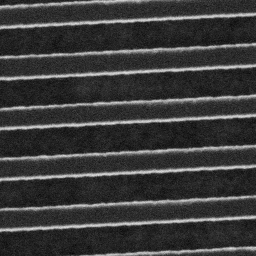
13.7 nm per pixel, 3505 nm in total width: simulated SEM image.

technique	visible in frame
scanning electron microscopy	lines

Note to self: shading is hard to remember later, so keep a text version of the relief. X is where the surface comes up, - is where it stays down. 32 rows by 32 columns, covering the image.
------XXXXXXXXXXXXXXXXXXXXXXXXXX
XXXXXXXXXXXXXXXXXXXXXXXXXXXXXXXX
XXXXXXXXXXXXXXXXXXXX------------
--------------------------------
--------------------------------
-------------------------------X
-------------XXXXXXXXXXXXXXXXXXX
XXXXXXXXXXXXXXXXXXXXXXXXXXXXXXXX
XXXXXXXXXXXXXXXXXXXXXXXXXXXX----
XXXXXXXX------------------------
--------------------------------
--------------------------------
---------------------XXXXXXXXXXX
-XXXXXXXXXXXXXXXXXXXXXXXXXXXXXXX
XXXXXXXXXXXXXXXXXXXXXXXXXXXXXXXX
XXXXXXXXXXXX--------------------
--------------------------------
--------------------------------
-------------------------XXXXXXX
-------XXXXXXXXXXXXXXXXXXXXXXXXX
XXXXXXXXXXXXXXXXXXXXXXXXXXXXXXXX
XXXXXXXXXXXXXXXXXXX-------------
--------------------------------
--------------------------------
--------------------------------
-------------XXXXXXXXXXXXXXXXXXX
XXXXXXXXXXXXXXXXXXXXXXXXXXXXXXXX
XXXXXXXXXXXXXXXXXXXXXXXXXXX-----
XXXXX---------------------------
--------------------------------
--------------------------------
--------------------XXXXXXXXXXXX